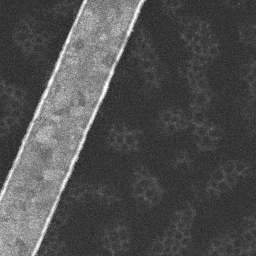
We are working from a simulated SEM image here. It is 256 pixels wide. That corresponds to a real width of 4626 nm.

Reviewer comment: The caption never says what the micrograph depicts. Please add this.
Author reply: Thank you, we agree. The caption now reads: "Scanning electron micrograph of one or a few lines or trenches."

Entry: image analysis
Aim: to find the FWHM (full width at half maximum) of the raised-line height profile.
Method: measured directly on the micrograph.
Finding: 953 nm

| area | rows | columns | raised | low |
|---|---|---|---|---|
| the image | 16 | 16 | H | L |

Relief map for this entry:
LLLLLHHHHLLLLLLL
LLLLLHHHLLLLLLLL
LLLLHHHHLLLLLLLL
LLLLHHHLLLLLLLLL
LLLHHHHLLLLLLLLL
LLLHHHHLLLLLLLLL
LLLHHHLLLLLLLLLL
LLHHHHLLLLLLLLLL
LLHHHLLLLLLLLLLL
LHHHHLLLLLLLLLLL
LHHHLLLLLLLLLLLL
HHHHLLLLLLLLLLLL
HHHHLLLLLLLLLLLL
HHHLLLLLLLLLLLLL
HHHLLLLLLLLLLLLL
HHLLLLLLLLLLLLLL